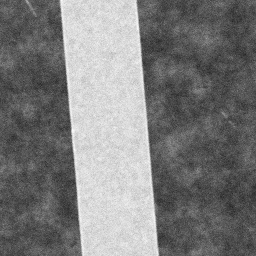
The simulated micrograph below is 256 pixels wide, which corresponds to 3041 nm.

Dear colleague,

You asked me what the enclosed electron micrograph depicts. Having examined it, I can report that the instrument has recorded one or a few lines or trenches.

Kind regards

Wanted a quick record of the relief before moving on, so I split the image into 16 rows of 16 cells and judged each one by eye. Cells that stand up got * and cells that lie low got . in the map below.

....*****.......
....*****.......
....*****.......
....*****.......
....*****.......
....*****.......
....*****.......
....*****.......
.....****.......
.....****.......
.....****.......
.....****.......
.....*****......
.....*****......
.....*****......
.....*****......